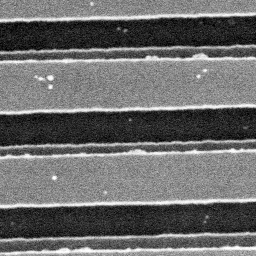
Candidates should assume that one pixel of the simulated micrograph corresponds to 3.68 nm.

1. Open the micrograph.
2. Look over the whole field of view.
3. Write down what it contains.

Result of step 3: lines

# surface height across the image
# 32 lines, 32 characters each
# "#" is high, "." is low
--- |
################################
################################
####.##.........................
................................
................................
................................
................................
........#..#####################
################################
################################
################################
################################
################################
#######################.........
................................
................................
................................
................................
................................
.#.##.##########################
################################
################################
################################
################################
################################
############....................
................................
................................
................................
................................
................................
...#############################